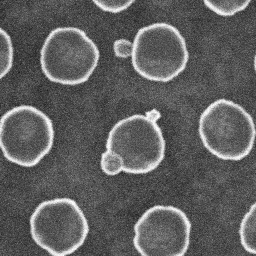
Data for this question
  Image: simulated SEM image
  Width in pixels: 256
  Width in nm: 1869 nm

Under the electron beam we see raised bodies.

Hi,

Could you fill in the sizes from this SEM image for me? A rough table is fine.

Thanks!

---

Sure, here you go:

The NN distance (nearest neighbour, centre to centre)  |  0.675 µm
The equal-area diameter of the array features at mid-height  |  56.5 px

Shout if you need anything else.